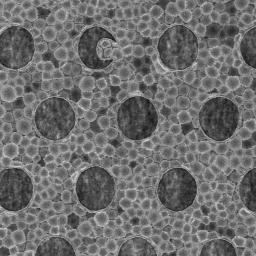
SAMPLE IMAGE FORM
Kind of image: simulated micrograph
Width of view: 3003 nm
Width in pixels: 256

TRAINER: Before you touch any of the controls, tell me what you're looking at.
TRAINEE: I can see a regular array of holes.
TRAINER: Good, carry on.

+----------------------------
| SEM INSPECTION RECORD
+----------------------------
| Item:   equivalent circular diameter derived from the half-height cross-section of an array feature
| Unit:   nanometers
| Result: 470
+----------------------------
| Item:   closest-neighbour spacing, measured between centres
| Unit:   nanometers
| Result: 804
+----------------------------